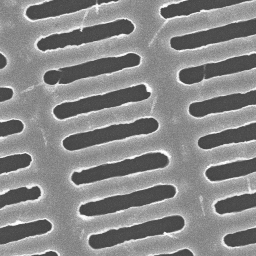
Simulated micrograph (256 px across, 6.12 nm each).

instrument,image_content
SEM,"holes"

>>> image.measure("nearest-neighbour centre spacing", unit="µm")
0.204